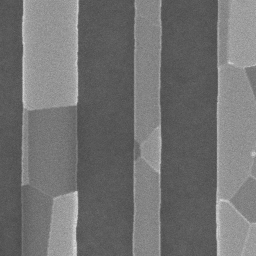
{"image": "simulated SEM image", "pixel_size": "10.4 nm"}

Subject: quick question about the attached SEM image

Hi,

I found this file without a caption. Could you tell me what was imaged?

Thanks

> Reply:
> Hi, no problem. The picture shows wiring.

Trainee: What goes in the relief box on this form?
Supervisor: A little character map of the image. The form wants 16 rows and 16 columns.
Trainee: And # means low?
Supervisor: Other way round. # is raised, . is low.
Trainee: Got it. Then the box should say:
.####...##....##
.####...##....##
.####...##....##
.####...##....##
.####...##....##
.####...##....##
.####...##....##
.####...##....##
.####...##....##
.####...##....##
.####...##....##
.####...##....##
.####...##....##
.####...##....##
.####...##....##
.####...##....##